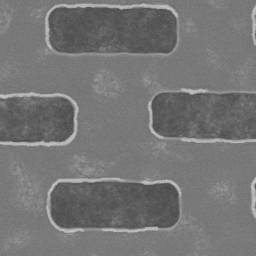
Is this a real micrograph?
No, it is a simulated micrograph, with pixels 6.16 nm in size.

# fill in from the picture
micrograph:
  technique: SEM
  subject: holes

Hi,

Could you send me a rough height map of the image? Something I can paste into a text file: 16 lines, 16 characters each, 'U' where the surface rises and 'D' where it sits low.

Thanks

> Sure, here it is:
UUUUDDDUUUUUUUUU
UUUDDDDDDDDUUUUU
UUUDDDDDDDDUUUUU
UUUUUUUUUUUUUUUU
UUUUUUUUUUUUUUUU
UUUUUUUUUUUUUUUU
DDDDUUUUUUDDDDDD
DDDDDUUUUUDDDDDD
DDDDUUUUUUDDDDDD
UUUUUUUUUUUUUUUU
UUUUUUUUUUUUUUUU
UUUUDDDDDUDUUUUU
UUUDDDDDDDDUUUUU
UUUDDDDDDDDUUUUU
UUUUUUUUUUUUUUUU
UUUUUUUUUUUUUUUU